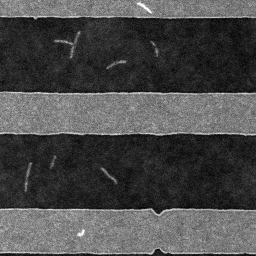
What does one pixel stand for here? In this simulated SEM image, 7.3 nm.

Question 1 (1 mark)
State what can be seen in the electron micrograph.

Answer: one or a few lines or trenches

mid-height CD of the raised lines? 42 pixels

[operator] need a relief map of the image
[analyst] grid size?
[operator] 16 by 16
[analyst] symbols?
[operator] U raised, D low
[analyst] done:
UUUUUUUUUUUUUUUU
DDDDDDDDDDDDDDDD
DDDDDDDDDDDDDDDD
DDDDDDDDDDDDDDDD
DDDDDDDDDDDDDDDD
DDDDDDDDDDDDDDDD
UUUUUUUUUUUUUUUU
UUUUUUUUUUUUUUUU
DDDDDDDDDDDDDDDD
DDDDDDDDDDDDDDDD
DDDDDDDDDDDDDDDD
DDDDDDDDDDDDDDDD
DDDDDDDDDDDDDDDD
UUUUUUUUUUUUUUUU
UUUUUUUUUUUUUUUU
UUUUUUUUUUUUUUUU